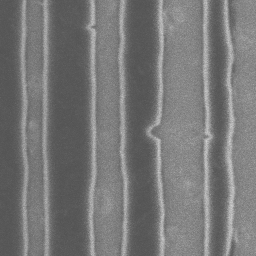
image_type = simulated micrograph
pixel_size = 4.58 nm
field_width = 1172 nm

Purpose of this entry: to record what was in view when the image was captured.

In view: one or a few lines or trenches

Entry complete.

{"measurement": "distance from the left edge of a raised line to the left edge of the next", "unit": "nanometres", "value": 340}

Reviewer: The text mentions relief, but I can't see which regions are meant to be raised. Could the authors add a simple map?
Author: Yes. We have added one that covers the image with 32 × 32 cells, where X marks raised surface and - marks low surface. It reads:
XXX---XXXXXX---XXXXX------XX----
XXX---XXXXXX---XXXXX------XX----
XXX---XXXXXX---XXXXX------XX----
XXX---XXXXXX---XXXXX------XX----
XXX---XXXXXX---XXXXX------XXX---
XXX---XXXXXX---XXXXX------XXX---
XXX---XXXXXX---XXXXX------XXX---
XXX---XXXXXX---XXXXX------XXX---
XXX---XXXXXX---XXXXX------XXX---
XXX---XXXXXX---XXXXX------XXX---
XXX---XXXXXX---XXXXX------XXX---
XXX---XXXXXX---XXXXX------XXX---
XXX---XXXXXX---XXXXX------XXX---
XXX---XXXXXX---XXXXX------XXX---
XXX---XXXXXX---XXXXX------XXX---
XXX---XXXXXX---XXXXX------XXX---
XXX---XXXXXX---XXXX-------XXX---
XXX---XXXXXX---XXXXX------XXX---
XXX---XXXXXX---XXXXX------XXX---
XXX---XXXXXX---XXXXX------XXX---
XXX---XXXXXX---XXXXX------XXX---
XXX---XXXXXX---XXXXX------XXX---
XXX---XXXXXX----XXXX------XXX---
XXX---XXXXXX----XXXX------XXX---
XXX---XXXXX-----XXXX------XXX---
XXX---XXXXX-----XXXX------XXX---
XXX---XXXXX-----XXXX------XXX---
XXX---XXXXX-----XXXX------XXX---
XXX---XXXXX-----XXXX------XXX---
XXX---XXXXX-----XXXX------XXX---
XXX---XXXXX----XXXXX------XXX---
XXX---XXXXXX---XXXXX------XXX---